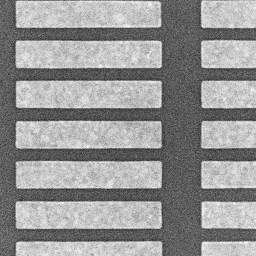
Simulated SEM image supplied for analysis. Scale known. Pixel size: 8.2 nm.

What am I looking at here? groups of lines, slits or small figures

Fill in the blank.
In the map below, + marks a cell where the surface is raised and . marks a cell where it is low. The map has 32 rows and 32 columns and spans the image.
..++++++++++++++++++.....+++++++
..++++++++++++++++++.....+++++++
..++++++++++++++++++.....+++++++
................................
................................
..++++++++++++++++++.....+++++++
..++++++++++++++++++.....+++++++
..++++++++++++++++++.....+++++++
................................
................................
..++++++++++++++++++.....+++++++
..++++++++++++++++++.....+++++++
..++++++++++++++++++.....+++++++
................................
................................
..++++++++++++++++++.....+++++++
..++++++++++++++++++.....+++++++
..++++++++++++++++++.....+++++++
................................
................................
..++++++++++++++++++.....+++++++
..++++++++++++++++++.....+++++++
..++++++++++++++++++.....+++++++
................................
................................
..++++++++++++++++++.....+++++++
..++++++++++++++++++.....+++++++
..++++++++++++++++++.....+++++++
...++++.........................
................................
..++++++++++++++++++......++++++
..++++++++++++++++++.....+++++++